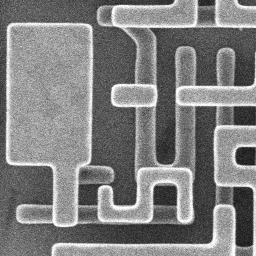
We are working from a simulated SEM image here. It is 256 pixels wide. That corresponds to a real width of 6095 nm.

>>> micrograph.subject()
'wiring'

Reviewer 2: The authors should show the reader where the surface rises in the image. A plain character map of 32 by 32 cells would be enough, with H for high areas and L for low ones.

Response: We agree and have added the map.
LLLLLLLLLLLLLLLLLLLLLHHHHLLHHHLL
LLLLLLLLLLLLLLHHHHHHHHHHHLLHHHHH
LLLLLLLLLLLLLLHHHHHHHHHHHLLHHHHH
LHHHHHHHHHHLLLLLLLLLLLLLLLLLLLLL
LHHHHHHHHHHLLLLLLLLLLLLLLLLLLLLL
LHHHHHHHHHHLLLLLLLLLLLLLLLLLLLLL
LHHHHHHHHHHLLLLLLLLLLLLLLLLLLLLL
LHHHHHHHHHHLLLLLLLLLLLLLLLLLLLLL
LHHHHHHHHHHLLLLLLLLLLLLLLLLLLLLL
LHHHHHHHHHHLLLLLLLLLLLLLLLLLLLLL
LHHHHHHHHHHLLLLLLLLLLLLLLLLLLLLL
LHHHHHHHHHHLLLHHHHHHLLHHHHHHHHHH
LHHHHHHHHHHLLLHHHHHHLLHHHHHHHHHH
LHHHHHHHHHHLLLLLLLLLLLLLLLLLLLLL
LHHHHHHHHHHLLLLLLLLLLLLLLLLLLLLL
LHHHHHHHHHHLLLLLLLLLLLLLLLLLLLLL
LHHHHHHHHHHLLLLLLLLLLLLLLLLHHHHH
LHHHHHHHHHHLLLLLLLLLLLLLLLLHHHHH
LHHHHHHHHHHLLLLLLLLLLLLLLLLHHHLL
LHHHHHHHHHHLLLLLLLLLLLLLLLLHHLLL
LHHHHHHHHHHLLLLLLLLLLLLLLLLHHHLL
LLLLLLLHHHLLLLLLLHHHHHHHLLLHHHHH
LLLLLLLHHHLLLLLLLHHHHHHHLLLHHHHH
LLLLLLLHHHLLLHLLLHHLLLHHLLLLLLLH
LLLLLLLHHHLLHHLLLHHLLLHHLLLLLLLL
LLLLLLLHHHLLHHLLLHHLLLHHLLLLLLLL
LLLLLLLHHHLLHHHHHHHLLLHHLLLHHLLL
LLLLLLLHHHLLLHHHHHHLLLHHLLLHHLLL
LLLLLLLLLLLLLLLLLLLLLLLLLLLHHLLL
LLLLLLLLLLLLLLLLLLLLLLLLLLLHHLLL
LLLLLLLHHLLLLLLLLLLLLLLLLLHHHLLL
LLLLLLLHHHHHHHHHHHHHHHHHHHHHHLLL